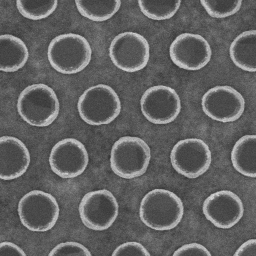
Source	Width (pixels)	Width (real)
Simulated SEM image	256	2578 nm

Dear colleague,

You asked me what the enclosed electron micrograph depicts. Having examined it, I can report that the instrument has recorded a regular array of raised bodies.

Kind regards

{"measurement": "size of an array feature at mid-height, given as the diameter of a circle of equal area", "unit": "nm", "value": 363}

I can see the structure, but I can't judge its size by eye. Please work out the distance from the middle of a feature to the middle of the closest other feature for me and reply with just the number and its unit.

606 nm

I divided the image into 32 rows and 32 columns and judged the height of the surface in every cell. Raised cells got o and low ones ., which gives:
..ooooo...ooooo...oooo....oooo..
...ooo....oooo....oooo....ooo...
................................
................................
........oo.....oo......oo.....oo
ooo....oooo...oooo....oooo...ooo
ooo...ooooo...oooo....oooo...ooo
ooo...ooooo...oooo....oooo...ooo
oo.....ooo.....oo.......o......o
................................
................................
...ooo.....ooo.....ooo....ooo...
..ooooo...ooooo...oooo...ooooo..
..ooooo...ooooo...oooo....oooo..
...oooo...oooo....oooo....oooo..
....oo..........................
................................
oo.............oo......oo.....oo
ooo....ooo....oooo....oooo...ooo
ooo...ooooo...oooo....oooo...ooo
ooo...ooooo...oooo....oooo...ooo
ooo....ooo.....oo......oo.....oo
................................
................................
...ooo.....ooo....oooo.....oo...
..ooooo...oooo....ooooo...oooo..
..ooooo...ooooo...ooooo...oooo..
...oooo....ooo....oooo....oooo..
....oo.............o............
................................
........o.......o..............o
ooo....oooo...oooo....oooo....oo